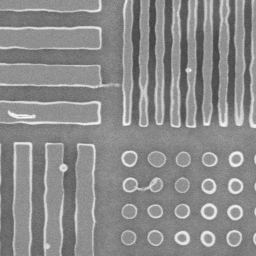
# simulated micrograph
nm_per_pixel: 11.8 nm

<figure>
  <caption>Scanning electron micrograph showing groups of lines, slits or small figures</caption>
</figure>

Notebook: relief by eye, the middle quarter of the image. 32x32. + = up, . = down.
+++++++++......++..++..++..++..+
+++++++++......++..++..++..++..+
+++++++++......++..++..++..++..+
+++++++++......++..++..++..++..+
+++++++++......++..++..++..++..+
......++++.....++..++..++..++..+
...............++..+...++..++..+
...............++......++..++..+
...............++..++..+...++..+
...............++..++..++..++..+
+++++++++......++..++..++..++..+
+++++++++......++..++..++..++..+
+++++++++......+...++..++..++..+
+++++++++......+...++..++..++..+
+++++++++......+...++..+...++..+
...........................++..+
................................
................................
................................
................................
....+++.........................
....++++........................
....++++.......+++....++.....++.
....++++.......+++...++++...+++.
...+++++.......+++...++++...+++.
...++++................+.....++.
...++++.........................
...++++.........................
...++++.........................
...++++........+++....++....+++.
...++++........+++...+++....+++.
...++++........+++....++....+++.